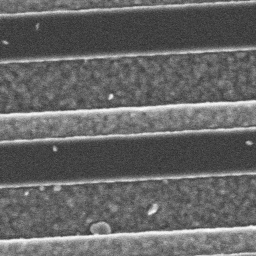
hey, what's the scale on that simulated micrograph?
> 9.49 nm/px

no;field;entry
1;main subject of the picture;lines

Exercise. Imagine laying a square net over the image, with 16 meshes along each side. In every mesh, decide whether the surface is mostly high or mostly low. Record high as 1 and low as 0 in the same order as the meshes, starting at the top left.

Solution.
1111111111111111
1111111111111111
1111111111111111
1111111100000000
0000000000000000
0000000000000000
0000000000001111
1111111111111111
1111111111111111
1111111111111111
1111111111111111
1111100000000000
0000000000000000
0000000000000000
0000000000111111
1111111111111111